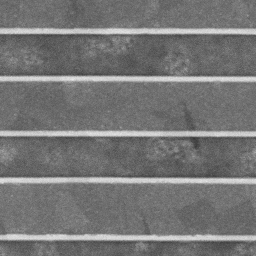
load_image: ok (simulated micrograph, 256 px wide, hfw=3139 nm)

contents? one or a few lines or trenches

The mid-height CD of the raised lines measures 694 nanometers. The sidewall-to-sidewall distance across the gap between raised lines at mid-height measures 575 nm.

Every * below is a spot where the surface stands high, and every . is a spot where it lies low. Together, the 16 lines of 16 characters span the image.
****************
****************
................
................
................
****************
****************
****************
................
................
................
****************
****************
****************
****************
................